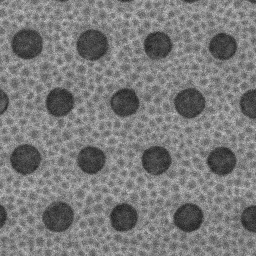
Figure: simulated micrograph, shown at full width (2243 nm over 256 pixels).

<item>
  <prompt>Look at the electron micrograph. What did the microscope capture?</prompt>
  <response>a regular array of holes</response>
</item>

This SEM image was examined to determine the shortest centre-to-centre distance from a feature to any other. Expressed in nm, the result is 569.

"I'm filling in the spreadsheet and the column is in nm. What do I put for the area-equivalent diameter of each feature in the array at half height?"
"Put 266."